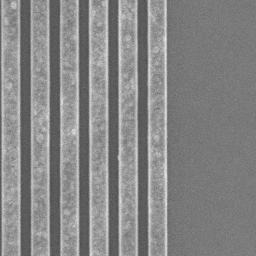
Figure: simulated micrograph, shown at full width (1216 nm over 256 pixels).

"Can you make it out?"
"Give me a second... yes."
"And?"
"parallel lines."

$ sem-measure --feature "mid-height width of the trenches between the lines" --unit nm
55.9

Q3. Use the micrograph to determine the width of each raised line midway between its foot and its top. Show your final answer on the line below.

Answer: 84.4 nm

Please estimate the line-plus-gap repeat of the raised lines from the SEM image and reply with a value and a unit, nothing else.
140 nanometres